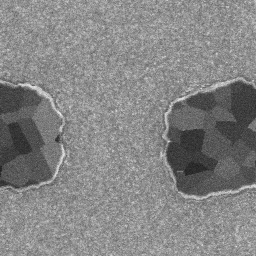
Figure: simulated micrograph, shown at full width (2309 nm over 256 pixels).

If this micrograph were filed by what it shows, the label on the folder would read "raised bodies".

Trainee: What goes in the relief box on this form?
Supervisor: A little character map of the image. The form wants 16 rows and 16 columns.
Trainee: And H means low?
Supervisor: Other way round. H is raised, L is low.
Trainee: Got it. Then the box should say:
LLLLLLLLLLLLLLLL
LLLLLLLLLLLLLLLL
LLLLLLLLLLLLLLLL
LLLLLLLLLLLLLLLL
LLLLLLLLLLLLLLLL
HHLLLLLLLLLLLHHH
HHHLLLLLLLLHHHHH
HHHHLLLLLLHHHHHH
HHHHLLLLLLHHHHHH
HHHHLLLLLLHHHHHH
HHHHLLLLLLLHHHHH
HHHLLLLLLLLHHHHH
LLLLLLLLLLLLLLLL
LLLLLLLLLLLLLLLL
LLLLLLLLLLLLLLLL
LLLLLLLLLLLLLLLL